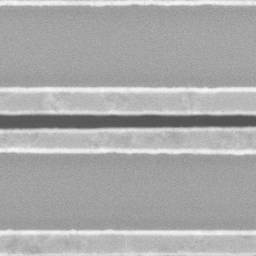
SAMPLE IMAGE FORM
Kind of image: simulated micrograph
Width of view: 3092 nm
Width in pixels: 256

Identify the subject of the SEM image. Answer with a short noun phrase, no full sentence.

lines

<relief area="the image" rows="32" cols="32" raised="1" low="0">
11111111111111110000111110000111
00000000000000000000000000000000
00000000000000000000000000000000
00000000000000000000000000000000
00000000000000000000000000000000
00000000000000000000000000000000
00000000000000000000000000000000
00000000000000000000000000000000
00000000000000000000000000000000
00000000000000000000000000000000
00000000000000000000000000000000
11111111111111111111111111111111
11111111111111111111111111111111
11111111111111111111111111111111
00000000000000000000000000000000
00000000000000000000000000000000
11111111111111111111111111111111
11111111111111111111111111111111
11111111111111111111111111111111
00000000000000000000000000000000
00000000000000000000000000000000
00000000000000000000000000000000
00000000000000000000000000000000
00000000000000000000000000000000
00000000000000000000000000000000
00000000000000000000000000000000
00000000000000000000000000000000
00000000000000000000000000000000
00000000000000000000000000000000
11111111111111111111111111111111
11111111111111111111111111111111
11111111111111111111111111111111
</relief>